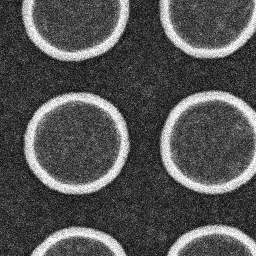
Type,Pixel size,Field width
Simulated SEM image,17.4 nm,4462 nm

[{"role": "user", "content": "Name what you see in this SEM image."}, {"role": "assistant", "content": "raised bodies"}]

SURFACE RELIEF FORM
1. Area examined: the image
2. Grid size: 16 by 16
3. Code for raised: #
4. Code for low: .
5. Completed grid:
..######..######
..######..######
..#####....####.
....#...........
................
................
...###......###.
..#####....#####
..######..######
..######..######
..#####....#####
...###......###.
................
................
....#.......###.
...####....#####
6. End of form